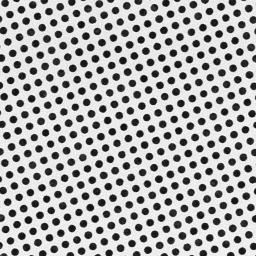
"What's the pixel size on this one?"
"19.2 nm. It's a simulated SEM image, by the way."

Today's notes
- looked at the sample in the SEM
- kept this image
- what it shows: a regular array of holes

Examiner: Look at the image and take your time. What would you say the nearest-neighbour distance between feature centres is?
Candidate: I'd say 233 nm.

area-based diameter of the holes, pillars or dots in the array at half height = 150 nanometers